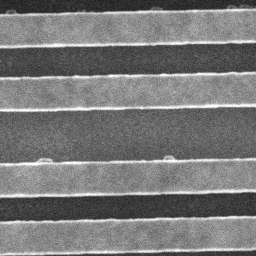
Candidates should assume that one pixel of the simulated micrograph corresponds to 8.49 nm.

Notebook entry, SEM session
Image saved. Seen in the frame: lines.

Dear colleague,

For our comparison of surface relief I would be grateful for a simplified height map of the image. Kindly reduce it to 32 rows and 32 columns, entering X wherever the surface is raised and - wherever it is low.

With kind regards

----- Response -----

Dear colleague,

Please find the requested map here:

--------------------------------
-----------------XXXXXXXXXXXXXXX
XXXXXXXXXXXXXXXXXXXXXXXXXXXXXXXX
XXXXXXXXXXXXXXXXXXXXXXXXXXXXXXXX
XXXXXXXXXXXXXXXXXXXXXXXXXXXXXXXX
XXXXXXXXXXXXXXXXXXXXXXXX--------
--------------------------------
--------------------------------
--------------------------------
-------------XXXXXXXXXXXXXXXXXXX
XXXXXXXXXXXXXXXXXXXXXXXXXXXXXXXX
XXXXXXXXXXXXXXXXXXXXXXXXXXXXXXXX
XXXXXXXXXXXXXXXXXXXXXXXXXXXXXXXX
XXXXXXXXXXXXXXXXXXXXXXX---------
--------------------------------
--------------------------------
--------------------------------
--------------------------------
--------------------------------
--------------------------------
--XXXXXXXXXXXXXXXXXXXXXXXXXXXXXX
XXXXXXXXXXXXXXXXXXXXXXXXXXXXXXXX
XXXXXXXXXXXXXXXXXXXXXXXXXXXXXXXX
XXXXXXXXXXXXXXXXXXXXXXXXXXXXXXXX
XXXXXXXXXXX---------------------
--------------------------------
--------------------------------
-------------XX-XXXXXXXXXXXXXXXX
XXXXXXXXXXXXXXXXXXXXXXXXXXXXXXXX
XXXXXXXXXXXXXXXXXXXXXXXXXXXXXXXX
XXXXXXXXXXXXXXXXXXXXXXXXXXXXXXXX
XXXXXXXXXXXXXXXXXXXXX-----------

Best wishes